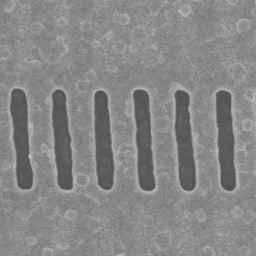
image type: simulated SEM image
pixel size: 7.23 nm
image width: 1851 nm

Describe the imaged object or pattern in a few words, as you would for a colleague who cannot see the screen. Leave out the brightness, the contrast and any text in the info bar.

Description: holes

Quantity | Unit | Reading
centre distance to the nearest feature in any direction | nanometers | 296